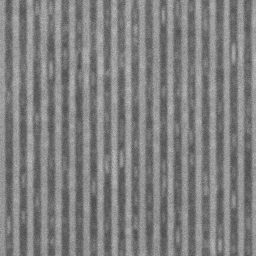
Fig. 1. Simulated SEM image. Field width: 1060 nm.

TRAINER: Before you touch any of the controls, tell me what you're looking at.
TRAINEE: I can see parallel lines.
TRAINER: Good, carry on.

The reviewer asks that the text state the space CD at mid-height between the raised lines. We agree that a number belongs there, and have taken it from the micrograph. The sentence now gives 37.8 nanometres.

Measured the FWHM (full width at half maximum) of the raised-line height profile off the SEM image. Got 0.0228 um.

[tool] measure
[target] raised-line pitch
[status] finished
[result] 58.2 nanometres